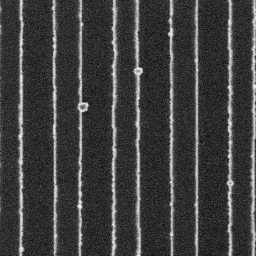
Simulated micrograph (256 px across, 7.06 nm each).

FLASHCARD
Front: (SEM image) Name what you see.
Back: lines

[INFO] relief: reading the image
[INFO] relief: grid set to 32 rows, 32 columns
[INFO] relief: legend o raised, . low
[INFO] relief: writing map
ooo....ooo....ooo....oooo....ooo
ooo....ooo....ooo....oooo....ooo
ooo....ooo....ooo....oooo....ooo
ooo....ooo....ooo....oooo....ooo
ooo....ooo....ooo....oooo....ooo
ooo....ooo....ooo....oooo....ooo
ooo....ooo....ooo....oooo....ooo
ooo....ooo....ooo....oooo....ooo
ooo....ooo....ooo....oooo....ooo
ooo....ooo....ooo....oooo....ooo
ooo....ooo....ooo....oooo....ooo
ooo....ooo....ooo....oooo....ooo
ooo....ooo....ooo....oooo....ooo
ooo....oooo...ooo....oooo....ooo
ooo....ooo....ooo....oooo....ooo
ooo....ooo....ooo....oooo....ooo
ooo....ooo....ooo....oooo....ooo
ooo....ooo....ooo....oooo....ooo
ooo....ooo....ooo....oooo....ooo
ooo....ooo....ooo....oooo....ooo
ooo....ooo....ooo....oooo....ooo
ooo....ooo....ooo....oooo....ooo
ooo....ooo....ooo....oooo....ooo
ooo....ooo....ooo....oooo....ooo
ooo....ooo....ooo....oooo....ooo
ooo....ooo....ooo....oooo....ooo
ooo....ooo....ooo....oooo....ooo
ooo....ooo....ooo....oooo....ooo
ooo....ooo....ooo....oooo....ooo
ooo....ooo....ooo....oooo....ooo
ooo....ooo....ooo....oooo....ooo
ooo....ooo....ooo....oooo....ooo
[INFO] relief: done